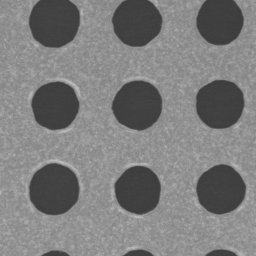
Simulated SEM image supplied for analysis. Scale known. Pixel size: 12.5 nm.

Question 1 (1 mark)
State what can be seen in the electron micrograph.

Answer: holes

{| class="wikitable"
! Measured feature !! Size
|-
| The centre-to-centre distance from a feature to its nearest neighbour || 1.03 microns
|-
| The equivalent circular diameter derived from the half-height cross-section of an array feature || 0.616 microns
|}